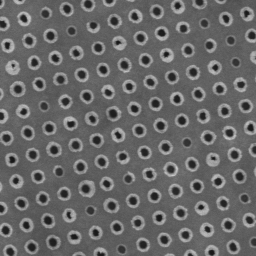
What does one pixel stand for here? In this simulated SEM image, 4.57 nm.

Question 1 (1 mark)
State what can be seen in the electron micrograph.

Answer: a regular array of holes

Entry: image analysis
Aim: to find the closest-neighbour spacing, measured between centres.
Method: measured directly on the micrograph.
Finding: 99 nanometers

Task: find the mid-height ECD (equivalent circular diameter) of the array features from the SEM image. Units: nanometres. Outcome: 38.3